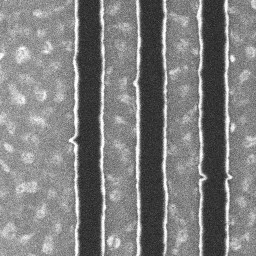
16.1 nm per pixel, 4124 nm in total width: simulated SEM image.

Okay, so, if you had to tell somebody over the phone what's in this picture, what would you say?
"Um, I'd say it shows parallel lines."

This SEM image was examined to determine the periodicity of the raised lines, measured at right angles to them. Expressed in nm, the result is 1000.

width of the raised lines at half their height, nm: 443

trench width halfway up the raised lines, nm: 552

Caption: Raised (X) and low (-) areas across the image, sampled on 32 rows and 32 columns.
----------XXX----XXXX----XXX----
---------XXXX----XXXX----XXX----
----------XXX----XXXX----XXX----
----------XXX----XXXX----XXX----
----------XXX----XXXX----XXX----
---------XXXX----XXXX----XXX----
---------XXXX----XXXX----XXX----
---------XXXX----XXXX----XXX----
---------XXXX----XXXX----XXX----
----------XXX----XXXX----XXX----
---------XXXX----XXXX----XXX----
---------XXXX----XXXX----XXX----
---------XXXX----XXXX----XXX----
---------XXXX----XXXX----XXX----
---------XXXX----XXXX----XXX----
---------XXXX----XXXX----XXX----
---------XXXX----XXXX----XXX----
---------XXXX----XXXX----XXX----
---------XXXX----XXXX----XXX----
---------XXXX----XXXX----XXX----
---------XXXX----XXXX----XXX----
---------XXXX----XXXX----XXXX---
---------XXXX----XXXX----XXXX---
---------XXXX----XXXX----XXX----
----------XXX----XXXX----XXXX---
----------XXX----XXXX----XXXX---
----------XXX----XXXX----XXXX---
----------XXX----XXXX----XXX----
---------XXXX----XXXX----XXX----
---------XXXX----XXXX----XXXX---
----------XXX----XXXX----XXX----
---------XXXX----XXXX----XXX----